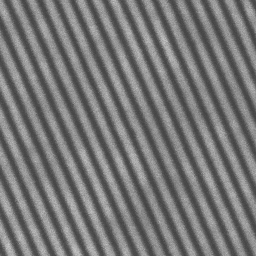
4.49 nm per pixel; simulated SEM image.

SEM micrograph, parallel lines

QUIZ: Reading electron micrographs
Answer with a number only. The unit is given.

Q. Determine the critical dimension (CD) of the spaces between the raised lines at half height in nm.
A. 33.9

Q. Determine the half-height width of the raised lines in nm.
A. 34.4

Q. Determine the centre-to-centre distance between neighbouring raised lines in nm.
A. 67.6